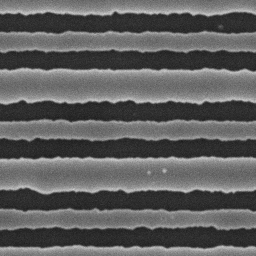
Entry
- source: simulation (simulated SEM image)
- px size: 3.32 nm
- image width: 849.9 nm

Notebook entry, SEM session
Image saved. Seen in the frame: lines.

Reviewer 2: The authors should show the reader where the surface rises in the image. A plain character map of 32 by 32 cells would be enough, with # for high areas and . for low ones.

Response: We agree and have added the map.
################################
##############################.#
................................
................................
################################
################################
#...............................
................................
................................
################################
################################
################################
################################
................................
................................
################################
################################
...#.......#................#...
................................
................................
################################
################################
################################
################################
................................
................................
################################
################################
###.#...#.####.##..#.#.....#####
................................
................................
################################